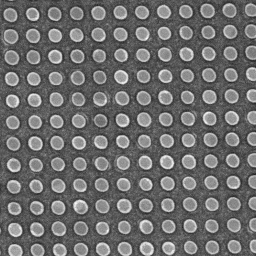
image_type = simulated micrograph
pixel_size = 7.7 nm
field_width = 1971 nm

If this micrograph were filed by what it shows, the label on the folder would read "a regular array of raised bodies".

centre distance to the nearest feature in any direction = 164 nm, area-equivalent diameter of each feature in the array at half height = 99.9 nm